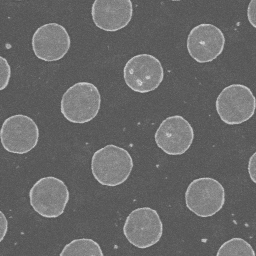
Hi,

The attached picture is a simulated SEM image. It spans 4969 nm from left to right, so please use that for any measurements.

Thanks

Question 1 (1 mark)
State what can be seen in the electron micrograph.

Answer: a regular array of raised bodies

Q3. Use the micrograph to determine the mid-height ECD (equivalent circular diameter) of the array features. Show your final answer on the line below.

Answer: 743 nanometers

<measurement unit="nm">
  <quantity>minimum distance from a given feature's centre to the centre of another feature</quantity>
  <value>1330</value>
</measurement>